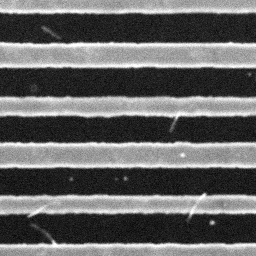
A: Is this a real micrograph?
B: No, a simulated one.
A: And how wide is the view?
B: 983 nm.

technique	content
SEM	lines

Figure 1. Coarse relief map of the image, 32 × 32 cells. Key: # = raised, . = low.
################################
########################...####.
................................
................................
................................
#####.##.#######################
################################
################################
................................
................................
................................
................................
################################
################################
.....................##.........
................................
................................
................................
################################
################################
################################
................................
................................
................................
............##...........#......
################################
##########.#####################
................................
................................
................................
......#.........................
################################